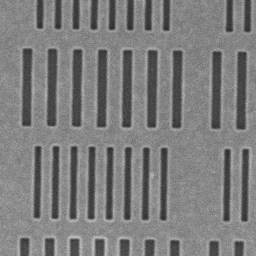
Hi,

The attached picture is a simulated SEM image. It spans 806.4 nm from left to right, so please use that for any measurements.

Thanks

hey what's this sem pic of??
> groups of lines, slits or small figures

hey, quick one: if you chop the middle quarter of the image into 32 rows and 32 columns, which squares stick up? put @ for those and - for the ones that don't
@@---@@@---@@@@--@@@@---@@@---@@
@@---@@@---@@@@--@@@@--@@@@---@@
@@---@@@---@@@@--@@@@--@@@@---@@
@@---@@@---@@@@--@@@@--@@@@---@@
@@---@@@---@@@@--@@@@--@@@@---@@
@@---@@@---@@@---@@@@--@@@@---@@
@@---@@@---@@@---@@@@--@@@@---@@
@@---@@@---@@@---@@@@--@@@@---@@
@@---@@@---@@@---@@@@--@@@@---@@
@@---@@@---@@@---@@@@--@@@@---@@
@@---@@@---@@@---@@@@--@@@@---@@
@@---@@@---@@@---@@@@--@@@@---@@
@@---@@@---@@@---@@@@--@@@@--@@@
@@---@@@---@@@---@@@@--@@@@--@@@
@@---@@@---@@@---@@@@--@@@@--@@@
@@--@@@@---@@@---@@@@--@@@@--@@@
@@@@@@@@@@@@@@@@@@@@@@@@@@@@@@@@
@@@@@@@@@@@@@@@@@@@@@@@@@@@@@@@@
@@@@@@@@@@@@@@@@@@@@@@@@@@@@@@@@
@@@@@@@@@@@@@@@@@@@@@@@@@@@@@@@@
@@-@@@@@@@@@@@@@@@@@@@@@@@@@@@@@
@---@@--@@@--@@--@@@--@@--@@@@@@
@--@@@--@@@--@@--@@---@@--@@@@@@
@--@@@--@@@--@@--@@--@@@--@@@@@@
@--@@@--@@@--@@--@@--@@@--@@@@@@
@--@@@--@@@--@@--@@--@@@--@@@@@@
@--@@@--@@@--@@--@@--@@@--@@@@@@
@--@@@--@@---@@--@@--@@@--@@@@@@
@--@@@--@@---@@--@@--@@@--@@@@@@
@--@@@--@@--@@@--@@--@@@--@@@@@@
@--@@@--@@--@@@--@@--@@@--@@@@@@
@--@@@--@@--@@@--@@--@@@--@@@@@@